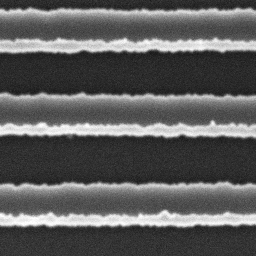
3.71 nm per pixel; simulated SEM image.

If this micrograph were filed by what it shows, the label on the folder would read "lines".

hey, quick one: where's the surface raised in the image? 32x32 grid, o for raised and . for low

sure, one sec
................................
ooooo..oooooooo..ooo..oooooooooo
oooooooooooooooooooooooooooooooo
oooooooooooooooooooooooooooooooo
oooooooooooooooooooooooooooooooo
oooooooooooooooooooooooooooooooo
........o.......................
................................
................................
................................
................................
................................
oooooooooooooooooooooooooooooooo
oooooooooooooooooooooooooooooooo
oooooooooooooooooooooooooooooooo
oooooooooooooooooooooooooooooooo
oooooooooooooooooooooooooooooooo
................................
................................
................................
................................
................................
................................
oooooooooooooooooooooooooooooooo
oooooooooooooooooooooooooooooooo
oooooooooooooooooooooooooooooooo
oooooooooooooooooooooooooooooooo
oooooooooooooooooooooooooooooooo
................................
................................
................................
................................